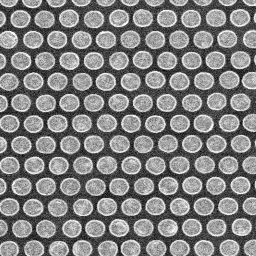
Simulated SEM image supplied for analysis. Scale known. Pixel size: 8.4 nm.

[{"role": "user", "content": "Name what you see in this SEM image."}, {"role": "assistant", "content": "a regular array of raised bodies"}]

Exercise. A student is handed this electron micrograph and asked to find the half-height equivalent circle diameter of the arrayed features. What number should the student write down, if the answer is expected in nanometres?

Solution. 155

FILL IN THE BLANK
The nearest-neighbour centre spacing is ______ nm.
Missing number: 199